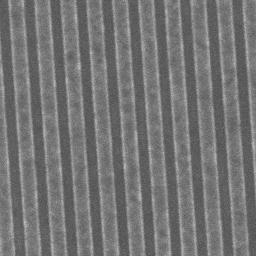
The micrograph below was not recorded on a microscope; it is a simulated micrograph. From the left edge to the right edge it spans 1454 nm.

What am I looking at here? parallel lines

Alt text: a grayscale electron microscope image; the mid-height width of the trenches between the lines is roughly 68.7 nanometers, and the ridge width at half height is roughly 0.0794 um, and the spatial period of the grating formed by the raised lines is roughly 147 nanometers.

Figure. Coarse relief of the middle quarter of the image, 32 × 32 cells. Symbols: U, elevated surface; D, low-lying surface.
UUUUDDDUUUDDDUUUUDDDUUUDDDUUUUDD
UUUUDDDUUUDDDDUUUDDDUUUDDDUUUUDD
DUUUDDDUUUDDDDUUUDDDUUUDDDDUUUDD
DUUUDDDUUUDDDDUUUDDDUUUUDDDUUUDD
DUUUDDDUUUUDDDUUUDDDUUUUDDDUUUDD
DUUUDDDUUUUDDDUUUDDDUUUUDDDUUUDD
DUUUDDDUUUUDDDUUUDDDUUUUDDDUUUDD
DUUUDDDUUUUDDDUUUDDDDUUUDDDUUUDD
DUUUDDDDUUUDDDUUUDDDDUUUDDDUUUDD
DUUUUDDDUUUDDDUUUDDDDUUUDDDUUUUD
DUUUUDDDUUUDDDUUUDDDDUUUDDDUUUUD
DUUUUDDDUUUDDDUUUUDDDUUUDDDUUUUD
DUUUUDDDUUUDDDUUUUDDDUUUDDDUUUUD
DUUUUDDDUUUDDDUUUUDDDUUUDDDUUUUD
DUUUUDDDUUUDDDUUUUDDDUUUDDDUUUUD
DUUUUDDDUUUDDDDUUUDDDUUUDDDUUUUD
DDUUUDDDUUUDDDDUUUDDDUUUDDDUUUUD
DDUUUDDDUUUUDDDUUUDDDUUUUDDDUUUD
DDUUUDDDUUUUDDDUUUDDDUUUUDDDUUUD
DDUUUDDDUUUUDDDUUUDDDUUUUDDDUUUD
DDUUUDDDUUUUDDDUUUDDDUUUUDDDUUUD
DDUUUDDDUUUUDDDUUUDDDUUUUDDDUUUD
DDUUUDDDUUUUDDDUUUDDDDUUUDDDUUUD
DDUUUDDDDUUUDDDUUUDDDDUUUDDDUUUD
DDUUUUDDDUUUDDDUUUDDDDUUUDDDUUUU
DDUUUDDDDUUUDDDUUUUDDDUUUDDDUUUU
DDUUUUDDDUUUDDDUUUUDDDUUUDDDUUUU
DDUUUUDDDUUUDDDUUUUDDDUUUDDDUUUU
DDUUUUDDDUUUDDDUUUUDDDUUUDDDDUUU
DDUUUUDDDUUUDDDUUUUDDDUUUDDDDUUU
DDUUUUDDDUUUUDDDUUUDDDUUUDDDDUUU
DDDUUUDDDUUUUDDDUUUDDDUUUDDDDUUU